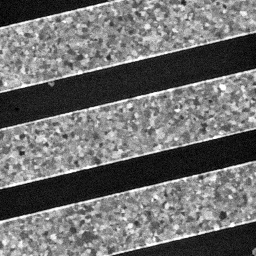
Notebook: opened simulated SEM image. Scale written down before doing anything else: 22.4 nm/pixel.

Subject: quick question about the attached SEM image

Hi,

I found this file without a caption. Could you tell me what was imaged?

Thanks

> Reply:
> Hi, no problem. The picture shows lines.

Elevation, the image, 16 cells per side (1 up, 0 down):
0000011111111111
0111111111111111
1111111111111100
1111111111000000
1111100000000001
1000000000011111
0000000111111111
0001111111111111
1111111111111100
1111111111000000
1111110000000011
1000000000111111
0000001111111111
0111111111111111
1111111111111000
1111111110000000